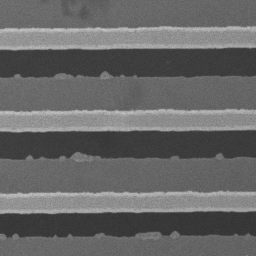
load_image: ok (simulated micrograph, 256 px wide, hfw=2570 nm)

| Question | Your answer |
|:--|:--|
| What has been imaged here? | lines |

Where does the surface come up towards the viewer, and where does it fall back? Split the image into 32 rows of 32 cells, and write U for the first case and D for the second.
UUUUUUUUUUUUUUUUUUUUUUUUUUUUUUUU
UUUUUUUUUUUUUUUUUUUUUUUUUUUUUUUU
UUUUUUUUUUUUUUUUUUUUUUUUUUUUUUUU
UUUUUUUUUUUUUUUUUUUUUUUUUUUUUUUU
UUUUUUUUUUUUUUUUUUUUUUUUUUUUUUUU
UUUUUUUUUUUUUUUUUUUUUUUUUUUUUUUU
DDDDDDDDDDDDDDDDDDDDDDDDDDDDDDDD
DDDDDDDDDDDDDDDDDDDDDDDDDDDDDDDD
DDDDDDDDDDDDDDDDDDDDDDDDDDDDDDDD
DDUDDDDUUUDDUUDUDDDDDDDDDDDDDDDD
UUUUUUUUUUUUUUUUUUUUUUUUUUUUUUUU
UUUUUUUUUUUUUUUUUUUUUUUUUUUUUUUU
UUUUUUUUUUUUUUUUUUUUUUUUUUUUUUUU
UUUUUUUUUUUUUUUUUUUUUUUUUUUUUUUU
UUUUUUUUUUUUUUUUUUUUUUUUUUUUUUUU
UUUUUUUUUUUUUUUUUUUUUUUUUUUUUUUU
DUUDUUDDDDDDDDDDDDDDDDDDDDDDDDDD
DDDDDDDDDDDDDDDDDDDDDDDDDDDDDDDD
DDDDDDDDDDDDDDDDDDDDDDDDDDDDDDDD
DDDDDDDDDUUDDDDDDDDDDDDDDDDUDDDD
UUUUUUUUUUUUUUUUUUUUUUUUUUUUUUUU
UUUUUUUUUUUUUUUUUUUUUUUUUUUUUUUU
UUUUUUUUUUUUUUUUUUUUUUUUUUUUUUUU
UUUUUUUUUUUUUUUUUUUUUUUUUUUUUUUU
UUUUUUUUUUUUUUUUUUUUUUUUUUUUUUUU
UUUUUUUUUUUUUUUUUUUUUUUUUUUUUUUU
UUUUUUUUUUUUUDUDUUDDDDDDDDDDDDDD
DDDDDDDDDDDDDDDDDDDDDDDDDDDDDDDD
DDDDDDDDDDDDDDDDDDDDDDDDDDDDDDDD
UDDDDDDDDDDDUUDDDUUUUUUDDDUUDUUU
UUUUUUUUUUUUUUUUUUUUUUUUUUUUUUUU
UUUUUUUUUUUUUUUUUUUUUUUUUUUUUUUU